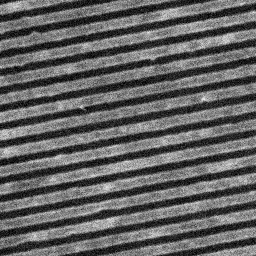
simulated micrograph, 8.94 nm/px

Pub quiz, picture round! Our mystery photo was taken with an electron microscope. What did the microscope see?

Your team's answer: parallel lines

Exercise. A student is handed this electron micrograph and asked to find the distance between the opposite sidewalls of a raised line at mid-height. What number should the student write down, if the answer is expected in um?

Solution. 0.0779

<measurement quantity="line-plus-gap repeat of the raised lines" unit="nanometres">158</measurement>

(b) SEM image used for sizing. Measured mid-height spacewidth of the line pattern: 77.9 nm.